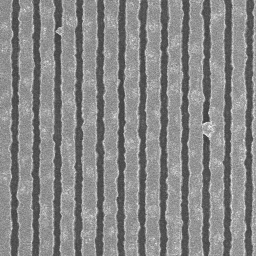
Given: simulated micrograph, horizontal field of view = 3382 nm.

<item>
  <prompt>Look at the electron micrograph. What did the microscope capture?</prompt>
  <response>parallel lines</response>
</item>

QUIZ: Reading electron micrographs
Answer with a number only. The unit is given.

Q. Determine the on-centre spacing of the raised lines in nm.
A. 281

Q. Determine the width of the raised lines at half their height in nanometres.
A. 187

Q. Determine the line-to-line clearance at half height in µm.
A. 0.0875